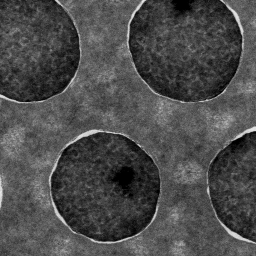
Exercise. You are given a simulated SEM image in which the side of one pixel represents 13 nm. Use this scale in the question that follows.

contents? holes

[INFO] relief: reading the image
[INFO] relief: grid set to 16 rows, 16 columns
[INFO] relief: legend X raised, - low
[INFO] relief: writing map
----XXXXX-----XX
-----XXX-------X
-----XXX-------X
-----XXX-------X
-----XXXX------X
----XXXXX-----XX
XXXXXXXXXXXXXXXX
XXXXXXXXXXXXXXXX
XXXXX---XXXXXXX-
XXXX-----XXXXX--
XXX-------XXX---
XXX-------XXX---
XXX-------XXX---
XXXX------XXXX--
XXXXX----XXXXX--
XXXXXXXXXXXXXXXX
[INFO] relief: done